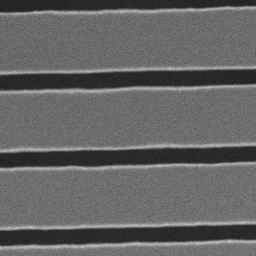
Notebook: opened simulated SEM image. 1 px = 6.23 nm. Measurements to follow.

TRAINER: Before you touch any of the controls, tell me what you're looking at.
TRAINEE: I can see lines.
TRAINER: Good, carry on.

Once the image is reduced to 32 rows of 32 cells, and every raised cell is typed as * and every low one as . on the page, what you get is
................................
...*****************************
********************************
********************************
********************************
********************************
********************************
********************************
********************************
................................
................................
********************************
********************************
********************************
********************************
********************************
********************************
********************************
*******************.............
................................
....................************
********************************
********************************
********************************
********************************
********************************
********************************
********************************
**************..................
................................
.............*******************
********************************